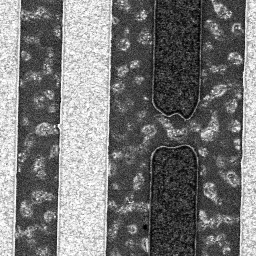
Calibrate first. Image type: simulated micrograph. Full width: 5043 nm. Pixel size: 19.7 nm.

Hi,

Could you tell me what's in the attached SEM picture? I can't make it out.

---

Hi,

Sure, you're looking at one or a few lines or trenches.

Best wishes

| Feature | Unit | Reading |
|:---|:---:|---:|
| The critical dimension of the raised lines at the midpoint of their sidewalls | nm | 945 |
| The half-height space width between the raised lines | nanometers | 857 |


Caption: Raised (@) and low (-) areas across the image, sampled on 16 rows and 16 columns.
@---@@@---@@@--@
@---@@@---@@@--@
@---@@@---@@@--@
@---@@@---@@@--@
@---@@@---@@@--@
@---@@@---@@---@
@---@@@---@@---@
@---@@@--------@
@---@@@--------@
@---@@@---@@---@
@---@@@--@@@---@
@---@@@--@@@---@
@---@@@--@@@---@
@---@@@--@@@---@
@---@@@--@@@---@
@---@@@--@@@---@